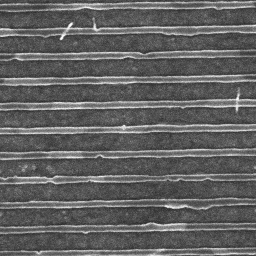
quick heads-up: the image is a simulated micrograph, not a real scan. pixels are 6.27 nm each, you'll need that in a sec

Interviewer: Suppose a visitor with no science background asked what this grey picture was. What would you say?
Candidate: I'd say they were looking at parallel lines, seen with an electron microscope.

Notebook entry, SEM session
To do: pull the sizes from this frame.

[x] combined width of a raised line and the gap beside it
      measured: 24.7 px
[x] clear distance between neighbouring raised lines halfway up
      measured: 115 nanometres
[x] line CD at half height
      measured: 0.0368 micrometres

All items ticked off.